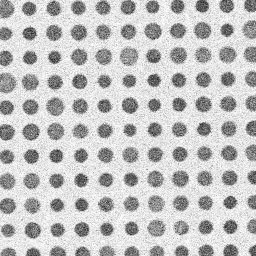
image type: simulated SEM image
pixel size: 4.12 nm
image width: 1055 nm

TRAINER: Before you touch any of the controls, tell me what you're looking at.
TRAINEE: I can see a regular array of holes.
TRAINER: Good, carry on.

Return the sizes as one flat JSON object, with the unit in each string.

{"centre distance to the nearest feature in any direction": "101 nanometers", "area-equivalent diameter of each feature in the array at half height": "63.4 nm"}